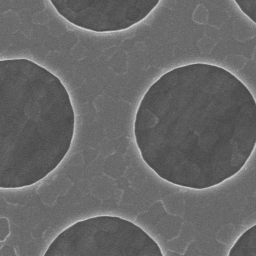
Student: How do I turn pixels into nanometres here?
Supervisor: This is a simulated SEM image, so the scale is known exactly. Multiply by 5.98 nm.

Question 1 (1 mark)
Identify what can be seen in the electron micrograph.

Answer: holes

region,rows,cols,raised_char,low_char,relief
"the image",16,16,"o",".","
ooo.......ooooo.
ooooo...oooooooo
oooooooooooooooo
oooooooooooooooo
...oooooooo...oo
....ooooo......o
....ooooo.......
.....ooo........
.....ooo........
....ooooo.......
...oooooo......o
..ooooooooo...oo
oooooooooooooooo
oooooooooooooooo
oooo.....oooooo.
ooo.......oooo..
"